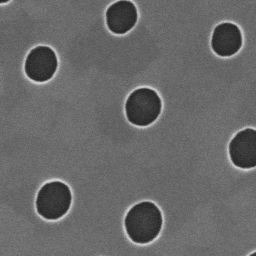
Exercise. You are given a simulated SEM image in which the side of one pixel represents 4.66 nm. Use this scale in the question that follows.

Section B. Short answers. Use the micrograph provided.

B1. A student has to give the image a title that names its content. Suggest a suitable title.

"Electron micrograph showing holes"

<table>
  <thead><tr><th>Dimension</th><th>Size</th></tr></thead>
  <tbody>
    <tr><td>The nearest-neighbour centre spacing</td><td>500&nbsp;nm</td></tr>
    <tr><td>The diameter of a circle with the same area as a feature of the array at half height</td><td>0.18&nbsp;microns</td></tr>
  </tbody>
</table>